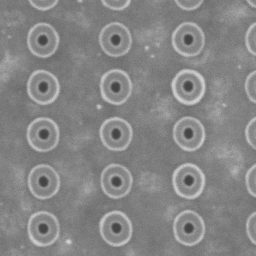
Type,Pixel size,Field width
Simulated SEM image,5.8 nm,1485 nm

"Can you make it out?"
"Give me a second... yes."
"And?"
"a regular array of ring-shaped raised bodies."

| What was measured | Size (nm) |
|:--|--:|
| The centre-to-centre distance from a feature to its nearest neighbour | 271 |